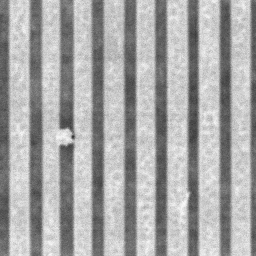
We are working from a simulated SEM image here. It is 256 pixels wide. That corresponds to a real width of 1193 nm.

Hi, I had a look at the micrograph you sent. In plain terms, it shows parallel lines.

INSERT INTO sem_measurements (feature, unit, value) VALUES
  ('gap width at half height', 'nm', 58.3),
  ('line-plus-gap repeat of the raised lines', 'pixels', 31.6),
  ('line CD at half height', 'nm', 89.8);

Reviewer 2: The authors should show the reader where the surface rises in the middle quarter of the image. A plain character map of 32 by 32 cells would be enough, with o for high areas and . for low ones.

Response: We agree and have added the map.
...oooo...ooooo...ooooo...ooooo.
...oooo...ooooo...ooooo...ooooo.
...oooo...ooooo...ooooo...ooooo.
...oooo...ooooo...ooooo...ooooo.
...oooo...ooooo...ooooo...ooooo.
...oooo...ooooo...ooooo...ooooo.
...oooo...ooooo...ooooo...ooooo.
...oooo...ooooo...ooooo...ooooo.
...oooo...ooooo...ooooo...ooooo.
...oooo...ooooo...ooooo...ooooo.
...oooo...ooooo...ooooo...ooooo.
...oooo...ooooo...ooooo...ooooo.
...oooo...ooooo...ooooo...ooooo.
...oooo...ooooo...ooooo...ooooo.
...oooo...ooooo...ooooo...ooooo.
...oooo...ooooo...ooooo...ooooo.
o..oooo...ooooo...ooooo...ooooo.
oo.oooo...ooooo...ooooo...ooooo.
oo.oooo...ooooo...ooooo...ooooo.
ooooooo...ooooo...ooooo...ooooo.
...oooo...ooooo...ooooo...ooooo.
...oooo...ooooo...ooooo...ooooo.
...oooo...ooooo...ooooo...ooooo.
...oooo...ooooo...ooooo...ooooo.
...oooo...ooooo...ooooo...ooooo.
...oooo...ooooo...ooooo...ooooo.
...oooo...ooooo...ooooo...ooooo.
...oooo...ooooo...ooooo...ooooo.
...oooo...ooooo...ooooo...ooooo.
...oooo...ooooo...ooooo...ooooo.
...oooo...ooooo...ooooo...ooooo.
...oooo...ooooo...ooooo...ooooo.